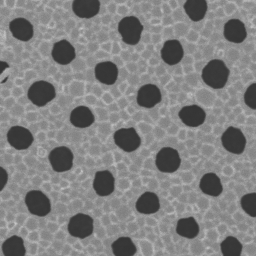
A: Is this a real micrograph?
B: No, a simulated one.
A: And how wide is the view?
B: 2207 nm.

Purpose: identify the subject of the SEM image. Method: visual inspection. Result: a regular array of holes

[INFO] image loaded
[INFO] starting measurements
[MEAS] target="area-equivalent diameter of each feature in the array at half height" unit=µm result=0.208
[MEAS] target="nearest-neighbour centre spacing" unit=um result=0.408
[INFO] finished